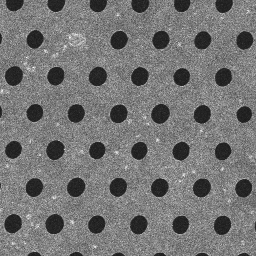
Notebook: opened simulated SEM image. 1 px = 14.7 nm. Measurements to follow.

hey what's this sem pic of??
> a regular array of holes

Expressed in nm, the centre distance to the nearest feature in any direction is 616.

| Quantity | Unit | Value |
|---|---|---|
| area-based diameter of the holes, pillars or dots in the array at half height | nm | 264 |